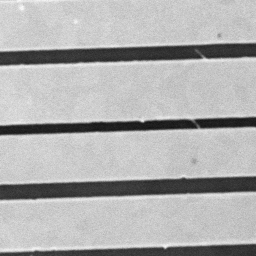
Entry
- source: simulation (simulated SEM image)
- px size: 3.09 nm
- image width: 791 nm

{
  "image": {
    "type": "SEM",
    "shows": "one or a few lines or trenches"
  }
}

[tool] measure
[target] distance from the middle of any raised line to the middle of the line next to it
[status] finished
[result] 65.4 pixels